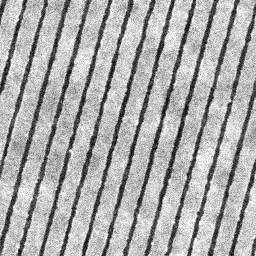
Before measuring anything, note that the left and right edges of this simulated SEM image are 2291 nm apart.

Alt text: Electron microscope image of parallel lines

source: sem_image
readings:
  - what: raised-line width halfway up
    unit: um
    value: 0.137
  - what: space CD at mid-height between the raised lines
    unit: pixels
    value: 5.66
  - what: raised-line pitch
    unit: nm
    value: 183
